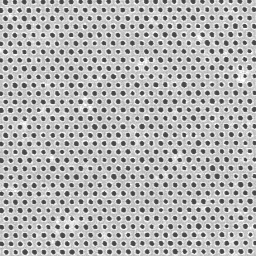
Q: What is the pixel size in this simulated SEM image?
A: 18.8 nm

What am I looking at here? a regular array of holes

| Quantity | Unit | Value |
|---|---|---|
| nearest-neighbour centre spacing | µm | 0.172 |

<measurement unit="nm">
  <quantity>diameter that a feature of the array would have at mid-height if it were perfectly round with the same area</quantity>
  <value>95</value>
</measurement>